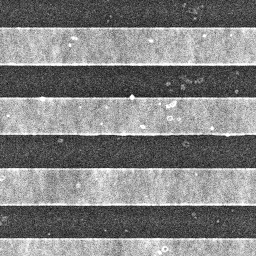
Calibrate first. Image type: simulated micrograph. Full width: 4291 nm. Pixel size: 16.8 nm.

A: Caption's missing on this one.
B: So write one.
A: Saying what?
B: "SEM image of lines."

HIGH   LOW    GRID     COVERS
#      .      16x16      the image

................
................
################
################
................
................
################
################
................
................
................
################
################
................
................
################